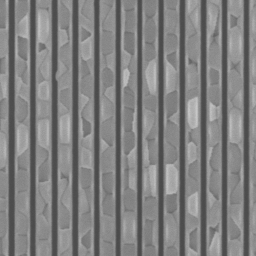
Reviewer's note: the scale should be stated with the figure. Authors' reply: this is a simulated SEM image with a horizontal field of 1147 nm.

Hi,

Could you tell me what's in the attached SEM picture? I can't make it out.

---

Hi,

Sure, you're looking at parallel lines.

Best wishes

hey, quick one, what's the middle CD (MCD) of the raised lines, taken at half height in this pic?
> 72.3 nanometers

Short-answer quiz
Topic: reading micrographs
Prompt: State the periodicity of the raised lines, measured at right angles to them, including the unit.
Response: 95.4 nm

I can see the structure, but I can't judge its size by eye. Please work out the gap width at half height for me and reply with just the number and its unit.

25.2 nm